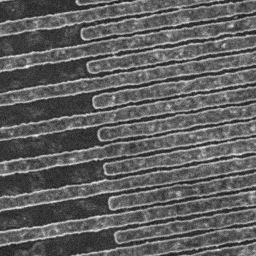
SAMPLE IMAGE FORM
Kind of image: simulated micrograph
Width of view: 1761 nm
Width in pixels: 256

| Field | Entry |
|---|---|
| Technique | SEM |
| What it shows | parallel lines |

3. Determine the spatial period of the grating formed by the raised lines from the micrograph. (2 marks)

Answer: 118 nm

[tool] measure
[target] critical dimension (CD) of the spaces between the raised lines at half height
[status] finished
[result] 27.1 nanometers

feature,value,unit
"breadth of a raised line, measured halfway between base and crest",0.0873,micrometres